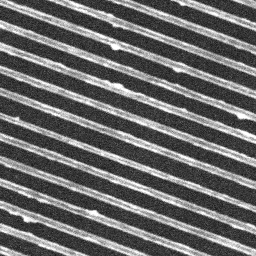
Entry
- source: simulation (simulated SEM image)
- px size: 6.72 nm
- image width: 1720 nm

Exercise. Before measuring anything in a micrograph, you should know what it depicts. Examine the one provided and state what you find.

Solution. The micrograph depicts parallel lines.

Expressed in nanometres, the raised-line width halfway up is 42.6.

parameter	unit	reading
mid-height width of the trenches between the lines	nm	97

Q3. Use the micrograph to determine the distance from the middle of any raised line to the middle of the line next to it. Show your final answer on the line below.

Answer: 142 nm